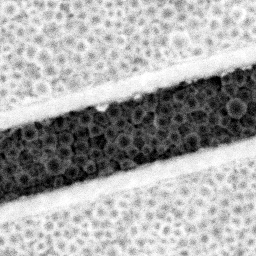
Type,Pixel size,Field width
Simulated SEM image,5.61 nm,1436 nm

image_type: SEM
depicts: one or a few lines or trenches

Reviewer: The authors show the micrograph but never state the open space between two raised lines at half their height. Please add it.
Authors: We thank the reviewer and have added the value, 515 nm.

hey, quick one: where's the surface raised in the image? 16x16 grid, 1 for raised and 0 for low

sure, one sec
1111111111111111
1111111111111111
1111111111111111
1111111111111110
1111111111100000
1111111100000000
1111000000000000
0000000000000000
0000000000000000
0000000000000001
0000000000011111
0000000111111111
0000111111111111
1111111111111111
1111111111111111
1111111111111111